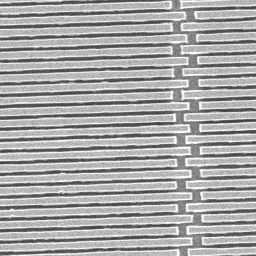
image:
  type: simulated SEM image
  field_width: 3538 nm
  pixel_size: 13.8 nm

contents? parallel lines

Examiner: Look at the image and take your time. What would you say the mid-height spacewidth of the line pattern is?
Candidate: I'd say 51.8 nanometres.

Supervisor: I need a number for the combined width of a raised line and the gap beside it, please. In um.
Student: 0.156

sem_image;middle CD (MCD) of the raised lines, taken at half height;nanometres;104